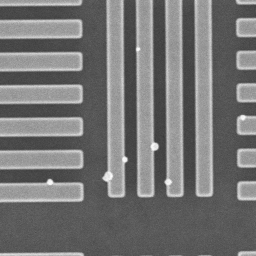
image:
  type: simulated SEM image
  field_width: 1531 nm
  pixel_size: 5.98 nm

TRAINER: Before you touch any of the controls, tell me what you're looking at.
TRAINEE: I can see groups of lines, slits or small figures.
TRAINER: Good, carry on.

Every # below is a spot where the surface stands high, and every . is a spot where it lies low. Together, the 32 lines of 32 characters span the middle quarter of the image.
####.......####...####...#####..
####.......####...####...#####..
...........####...####...#####..
...........####...####...#####..
...........####...####....####..
####.......####...####....####..
####.......####...####....####..
####.......####...####....####..
####.......####...####....####..
####.......####...####....####..
...........####...####....####..
...........####...####....####..
...........####...####....####..
...........####...####....####..
####.......####...####....####..
####.......####...####....####..
####.......####...####....####..
####.......####...####....####..
...........####...####....####..
...........####...####....####..
...........####...######..####..
...........####...#####...####..
####.......####...####....####..
#####......#####..####....####..
#####......#####..####....####..
####.......####...####....####..
...........####...####....####..
..........#####...####....####..
..........#####...####....####..
...........####....###...#####..
#####......####....###....####..
#####......####....###....####..